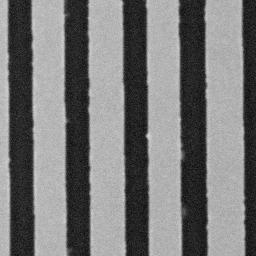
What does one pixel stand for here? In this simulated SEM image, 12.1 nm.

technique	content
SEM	lines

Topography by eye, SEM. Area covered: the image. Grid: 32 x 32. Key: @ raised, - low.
@---@@@@---@@@@---@@@@----@@@@--
@---@@@@---@@@@---@@@@----@@@@--
@---@@@@---@@@@---@@@@----@@@@--
@---@@@@---@@@@---@@@@----@@@@--
@---@@@@---@@@@---@@@@----@@@@--
@---@@@@---@@@@---@@@@----@@@@--
@---@@@@---@@@@---@@@@----@@@@--
@---@@@@---@@@@---@@@@----@@@@--
@---@@@@---@@@@---@@@@----@@@@--
@---@@@@---@@@@---@@@@----@@@@--
@---@@@@---@@@@---@@@@----@@@@--
@---@@@@---@@@@----@@@----@@@@--
@---@@@@---@@@@----@@@----@@@@--
@---@@@@---@@@@----@@@----@@@@--
@---@@@@---@@@@----@@@----@@@@--
@---@@@@---@@@@----@@@----@@@@--
@---@@@@---@@@@---@@@@----@@@@--
@---@@@@---@@@@---@@@@----@@@@--
@---@@@@---@@@@----@@@----@@@@--
@---@@@@---@@@@@---@@@----@@@@--
@---@@@@---@@@@@---@@@----@@@@--
@---@@@@---@@@@@---@@@----@@@@--
@---@@@@---@@@@@---@@@----@@@@--
@---@@@@---@@@@@---@@@----@@@@--
@---@@@@---@@@@@---@@@----@@@@@-
@---@@@@---@@@@@---@@@@---@@@@@-
@---@@@@---@@@@@---@@@----@@@@@-
@---@@@@---@@@@@---@@@@---@@@@@-
@---@@@@---@@@@@---@@@@---@@@@@-
@---@@@@---@@@@@---@@@@---@@@@@-
@---@@@@---@@@@@---@@@@---@@@@@-
@---@@@@---@@@@@---@@@@---@@@@@-